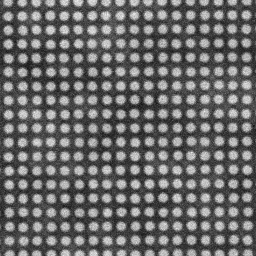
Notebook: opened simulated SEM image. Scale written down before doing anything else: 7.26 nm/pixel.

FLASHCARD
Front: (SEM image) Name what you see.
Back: a regular array of raised bodies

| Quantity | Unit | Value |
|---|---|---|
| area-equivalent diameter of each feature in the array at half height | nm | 65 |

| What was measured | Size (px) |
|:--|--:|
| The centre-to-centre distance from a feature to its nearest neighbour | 13.7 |